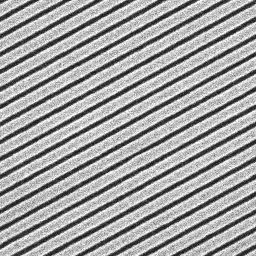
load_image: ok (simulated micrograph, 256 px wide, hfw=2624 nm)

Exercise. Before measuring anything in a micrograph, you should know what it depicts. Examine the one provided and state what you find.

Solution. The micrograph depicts parallel lines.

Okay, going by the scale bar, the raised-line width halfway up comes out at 0.113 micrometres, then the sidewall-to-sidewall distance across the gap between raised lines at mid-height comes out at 0.0472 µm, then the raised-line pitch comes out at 15.3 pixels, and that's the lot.